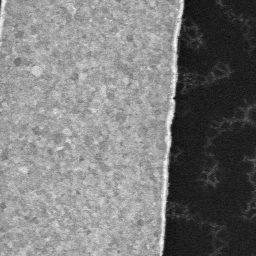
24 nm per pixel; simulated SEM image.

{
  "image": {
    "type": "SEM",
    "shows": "one or a few lines or trenches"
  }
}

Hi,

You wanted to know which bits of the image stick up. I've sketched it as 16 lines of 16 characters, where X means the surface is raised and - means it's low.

XXXXXXXXXXX-----
XXXXXXXXXXX-----
XXXXXXXXXXX-----
XXXXXXXXXXX-----
XXXXXXXXXXX-----
XXXXXXXXXXX-----
XXXXXXXXXXX-----
XXXXXXXXXXX-----
XXXXXXXXXX------
XXXXXXXXXX------
XXXXXXXXXX------
XXXXXXXXXX------
XXXXXXXXXX------
XXXXXXXXXX------
XXXXXXXXXX------
XXXXXXXXXX------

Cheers